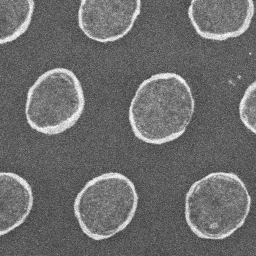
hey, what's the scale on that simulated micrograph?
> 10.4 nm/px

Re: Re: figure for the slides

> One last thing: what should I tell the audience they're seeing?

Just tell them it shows raised bodies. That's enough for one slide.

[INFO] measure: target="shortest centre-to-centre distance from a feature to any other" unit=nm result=1140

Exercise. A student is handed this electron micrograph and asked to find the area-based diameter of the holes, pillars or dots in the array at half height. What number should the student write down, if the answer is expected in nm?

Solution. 635